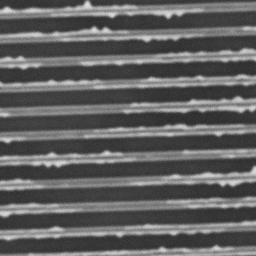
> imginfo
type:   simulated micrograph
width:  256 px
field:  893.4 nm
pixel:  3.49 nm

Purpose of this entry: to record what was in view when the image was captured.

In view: parallel lines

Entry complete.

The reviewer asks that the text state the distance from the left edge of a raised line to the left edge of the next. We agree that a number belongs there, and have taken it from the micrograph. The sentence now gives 85.5 nm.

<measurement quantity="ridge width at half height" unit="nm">28.4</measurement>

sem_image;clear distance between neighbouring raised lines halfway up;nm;56.7